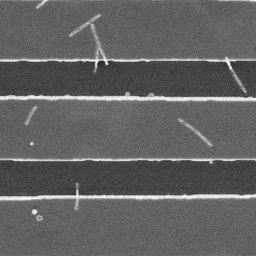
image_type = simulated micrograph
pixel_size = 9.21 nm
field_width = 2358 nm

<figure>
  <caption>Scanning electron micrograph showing lines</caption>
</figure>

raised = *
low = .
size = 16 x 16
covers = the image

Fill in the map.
****************
****************
****************
****************
................
................
****************
****************
****************
****************
................
................
****************
****************
****************
****************